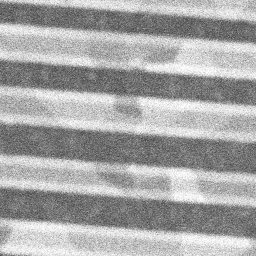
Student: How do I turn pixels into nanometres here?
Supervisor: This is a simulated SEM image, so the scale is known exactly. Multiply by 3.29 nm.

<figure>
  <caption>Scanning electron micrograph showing one or a few lines or trenches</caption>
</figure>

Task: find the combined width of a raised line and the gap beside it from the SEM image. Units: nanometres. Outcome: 212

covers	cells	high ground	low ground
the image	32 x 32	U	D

DDDDDDDDDDDDUUUUUUUUUUUUUUUUUUUU
DDDDDDDDDDDDDDDDDDDDDDDDUUUUUUUU
DDDDDDDDDDDDDDDDDDDDDDDDDDDDDDDD
DDDDDDDDDDDDDDDDDDDDDDDDDDDDDDDD
UUUUUUUUUUUUDDDDDDDDDDDDDDDDDDDD
UUUUUUUUUUUUUUUUUUUUUUUUUUDDDDDD
UUUUUUUUUUUUUUUUUUUUUUUUUUUUUUUU
DDDDDDDDUUUUUUUUUUUUUUUUUUUUUUUU
DDDDDDDDDDDDDDDDDDDDDUUUUUUUUUUU
DDDDDDDDDDDDDDDDDDDDDDDDDDDDDDDD
DDDDDDDDDDDDDDDDDDDDDDDDDDDDDDDD
UUUDDDDDDDDDDDDDDDDDDDDDDDDDDDDD
UUUUUUUUUUUUUUUDDDDDDDDDDDDDDDDD
UUUUUUUUUUUUUUUUUUUUUUUUUUUUDDDD
UUUUUUUUUUUUUUUUUUUUUUUUUUUUUUUU
DDDDDDDDDDUUUUUUUUUUUUUUUUUUUUUU
DDDDDDDDDDDDDDDDDDDDDUUUUUUUUUUU
DDDDDDDDDDDDDDDDDDDDDDDDDDDDDDDD
DDDDDDDDDDDDDDDDDDDDDDDDDDDDDDDD
DDDDDDDDDDDDDDDDDDDDDDDDDDDDDDDD
UUUUUUUUDDDDDDDDDDDDDDDDDDDDDDDD
UUUUUUUUUUUUUUUUUUUUUDDDDDDDDDDD
UUUUUUUUUUUUUUUUUUUUUUUUUUUUUUUU
DDDDDDDDDUUUUUUUUUUUUUUUUUUUUUUU
DDDDDDDDDDDDDDDDDDDDDDUUUUUUUUUU
DDDDDDDDDDDDDDDDDDDDDDDDDDDDDDDD
DDDDDDDDDDDDDDDDDDDDDDDDDDDDDDDD
DDDDDDDDDDDDDDDDDDDDDDDDDDDDDDDD
UUUUUUUDDDDDDDDDDDDDDDDDDDDDDDDD
UUUUUUUUUUUUUUUUUUUUDDDDDDDDDDDD
UUUUUUUUUUUUUUUUUUUUUUUUUUUUUUUU
DDDDDUUUUUUUUUUUUUUUUUUUUUUUUUUU